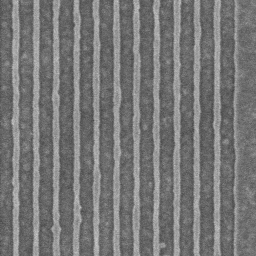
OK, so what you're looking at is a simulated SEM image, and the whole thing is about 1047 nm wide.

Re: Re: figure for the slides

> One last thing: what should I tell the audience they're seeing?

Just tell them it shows parallel lines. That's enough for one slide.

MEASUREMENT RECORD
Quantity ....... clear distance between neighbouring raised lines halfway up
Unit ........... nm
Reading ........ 59.8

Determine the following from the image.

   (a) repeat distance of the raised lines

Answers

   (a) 82.3 nanometers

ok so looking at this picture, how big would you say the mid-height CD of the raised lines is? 0.0215 um